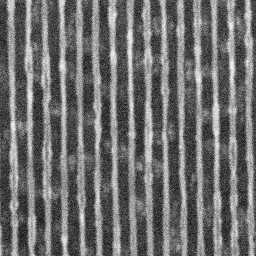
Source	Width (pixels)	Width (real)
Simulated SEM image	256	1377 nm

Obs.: parallel lines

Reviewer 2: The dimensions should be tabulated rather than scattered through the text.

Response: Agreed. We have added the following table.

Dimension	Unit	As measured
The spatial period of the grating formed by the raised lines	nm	91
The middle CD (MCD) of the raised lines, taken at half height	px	4.76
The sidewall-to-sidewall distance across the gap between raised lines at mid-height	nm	66.6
